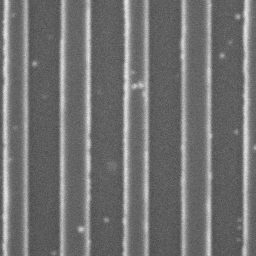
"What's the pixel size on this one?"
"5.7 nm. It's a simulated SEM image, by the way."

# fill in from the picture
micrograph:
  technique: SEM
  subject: lines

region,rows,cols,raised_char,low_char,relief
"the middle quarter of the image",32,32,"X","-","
XXXXXX---------XXXXXX---------XX
XXXXXX---------XXXXXX---------XX
XXXXXX---------XXXXXX---------XX
XXXXXX---------XXXXXX---------XX
XXXXXX---------XXXXXX---------XX
XXXXXX---------XXXXXX---------XX
XXXXXX---------XXXXXX---------XX
XXXXXX---------XXXXXX---------XX
XXXXXX---------XXXXXX---------XX
XXXXXX---------XXXXXX---------XX
XXXXXX---------XXXXXX---------XX
XXXXXX---------XXXXXX---------XX
XXXXXX---------XXXXXX---------XX
XXXXXX---------XXXXXX---------XX
XXXXXX---------XXXXXX---------XX
XXXXXX---------XXXXXX---------XX
XXXXXX---------XXXXXX---------XX
XXXXXX---------XXXXXX---------XX
XXXXXX---------XXXXXX---------XX
XXXXXX---------XXXXXX---------XX
XXXXXX---------XXXXXX--------XXX
XXXXXX---------XXXXXX---------XX
XXXXXX---------XXXXXX---------XX
XXXXXX---------XXXXXX---------XX
XXXXXX---------XXXXXX---------XX
XXXXXX---------XXXXXX---------XX
XXXXXX---------XXXXXX---------XX
XXXXXX---------XXXXXX---------XX
XXXXXX---------XXXXXX--------XXX
XXXXXX---------XXXXXX--------XXX
XXXXXX---------XXXXXX--------XXX
XXXXXX---------XXXXXX---------XX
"